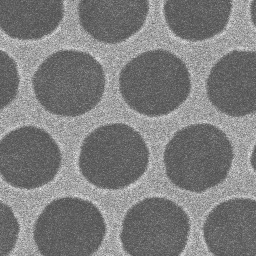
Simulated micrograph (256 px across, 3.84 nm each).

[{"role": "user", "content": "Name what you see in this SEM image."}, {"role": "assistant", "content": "holes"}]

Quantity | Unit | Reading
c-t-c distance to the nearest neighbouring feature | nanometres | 325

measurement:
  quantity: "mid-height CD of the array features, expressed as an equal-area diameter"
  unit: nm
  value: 269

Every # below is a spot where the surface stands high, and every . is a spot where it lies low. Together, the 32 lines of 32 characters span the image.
........##.........#.........##.
........##.........#.........##.
........##........###........##.
.......###........###.......####
#.....#####.....######.....#####
################################
.######....#######...########...
..####......####.......####.....
..###........##........###......
..##.........##.........##......
..##.........##.........##......
..##.........##.........##......
..###........##........###......
#####.......####......#####.....
#######...########..#########..#
#############...#########.######
#.....#####......#####......####
.......####.......###........###
.......###........###........###
........##.........#.........##.
........##........##.........##.
.......###........###........###
#......####......####.......####
##...#######...#######....######
################################
.#####......#####.....#####.....
..###........###.......###......
..##.........##.........##......
..##.........##.........#.......
..##.........##.........#.......
..##.........##........###......
.####.......####.......###......